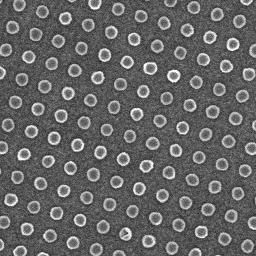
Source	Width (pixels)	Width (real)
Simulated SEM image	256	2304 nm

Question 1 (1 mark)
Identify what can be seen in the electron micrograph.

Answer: a regular array of raised bodies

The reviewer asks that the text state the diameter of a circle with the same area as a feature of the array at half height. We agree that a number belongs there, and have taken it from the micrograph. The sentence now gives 112 nm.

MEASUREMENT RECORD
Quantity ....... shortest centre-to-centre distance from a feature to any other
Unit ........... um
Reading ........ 0.211